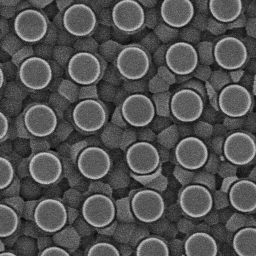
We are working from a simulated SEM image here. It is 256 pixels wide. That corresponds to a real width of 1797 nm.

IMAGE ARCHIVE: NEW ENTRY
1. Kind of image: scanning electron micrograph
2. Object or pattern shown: a regular array of raised bodies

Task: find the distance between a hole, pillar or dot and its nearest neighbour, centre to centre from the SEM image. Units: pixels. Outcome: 47.7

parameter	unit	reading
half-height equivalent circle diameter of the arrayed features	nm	214